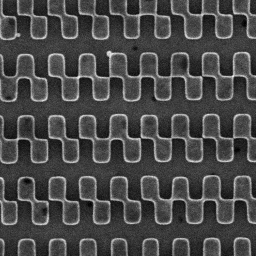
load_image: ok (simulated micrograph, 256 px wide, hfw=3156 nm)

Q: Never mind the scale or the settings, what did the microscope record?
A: wiring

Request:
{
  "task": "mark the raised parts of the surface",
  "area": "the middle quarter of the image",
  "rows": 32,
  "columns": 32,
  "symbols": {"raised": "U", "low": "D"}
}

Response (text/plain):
DDDDUUUUDDDDUUUUDDDUUUUDDDDUUUUD
DDDDUUUUDDDDUUUUDDDUUUUDDDDUUUUD
DDDDUUUUDDDDUUUUDDDUUUUDDDDUUUUD
UUUUDDDUUUUDDDUUUUUDDDUUUUUDDDUU
UUUUDDDUUUUDDDDUUUUDDDDUUUUDDDUU
UUUUDDDUUUUDDDDUUUUDDDDUUUUDDDDU
UUUUDDDUUUUDDDDUUUUDDDDUUUUDDDDU
UUUUDDDUUUUDDDDUUUUDDDDUUUUDDDDU
UUUUDDDDUUUDDDDUUUUDDDDUUUUDDDDU
DDDDDDDDDDDDDDDDDDDDDDDDDDDDDDDD
DDDDDDDDDDDDDDDDDDDDDDDDDDDDDDDD
DDDDDDDDDDDDDDDDDDDDDDDDDDDDDDDD
DDDDDDDDDDDDDDDDDDDDDDDDDDDDDDDD
DDDDUUUUDDDDUUUUDDDUUUUDDDDUUUUD
DDDDUUUUDDDDUUUUDDDUUUUDDDDUUUUD
DDDDUUUUDDDDUUUUDDDUUUUDDDDUUUUD
DDDDUUUUDDDDUUUUDDDUUUUDDDDUUUUD
DDDDUUUUDDDDUUUUDDDUUUUUDDDUUUUD
UDDDDUUUUDDUUUUUUDDDDUUUUDDDDUUU
UUUUDDDUUUUUDDDUUUUDDDDUUUUDDDUU
UUUUDDDUUUUUDDDUUUUDDDDUUUUDDDDU
UUUUDDDUUUUUDDDUUUUDDDDUUUUDDDDU
UUUUDDDUUUUUDDDUUUUDDDDUUUUDDDDU
UUUUDDDUUUUUDDDUUUUDDDDUUUUDDDDU
UUUDDDDDUUUDDDDDUUDDDDDDDDDDDDDD
DDDDDDDDDDDDDDDDDDDDDDDDDDDDDDDD
DDDDDDDDDDDDDDDDDDDDDDDDDDDDDDDD
DDDDDDDDDDDDDDDDDDDDDDDDDDDDDDDD
DDDDUUUUDDDDUUUDDDDDUUUDDDDDUUDD
DDDDUUUUDDDDUUUUDDDUUUUDDDDUUUUD
DDDDUUUUDDDDUUUUDDDUUUUDDDDUUUUD
DDDDUUUUDDDDUUUUDDDUUUUUDDDUUUUD